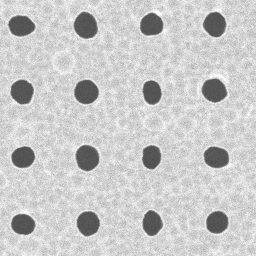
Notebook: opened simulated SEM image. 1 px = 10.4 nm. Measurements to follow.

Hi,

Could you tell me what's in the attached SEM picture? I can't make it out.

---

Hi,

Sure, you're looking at a regular array of holes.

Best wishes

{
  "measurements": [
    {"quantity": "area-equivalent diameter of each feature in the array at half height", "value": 243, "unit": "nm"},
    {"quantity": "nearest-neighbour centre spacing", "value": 666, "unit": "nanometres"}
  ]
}